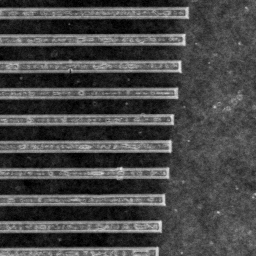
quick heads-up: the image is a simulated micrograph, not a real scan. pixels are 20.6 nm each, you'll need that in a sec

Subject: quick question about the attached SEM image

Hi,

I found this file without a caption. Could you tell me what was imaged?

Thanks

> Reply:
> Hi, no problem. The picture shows parallel lines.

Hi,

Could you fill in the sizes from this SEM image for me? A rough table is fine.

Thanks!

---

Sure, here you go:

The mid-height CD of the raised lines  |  0.193 microns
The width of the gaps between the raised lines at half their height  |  347 nanometres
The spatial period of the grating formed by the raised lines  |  549 nm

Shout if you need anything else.